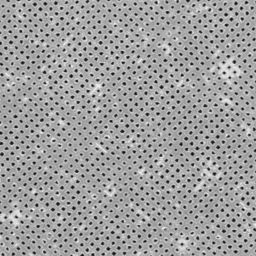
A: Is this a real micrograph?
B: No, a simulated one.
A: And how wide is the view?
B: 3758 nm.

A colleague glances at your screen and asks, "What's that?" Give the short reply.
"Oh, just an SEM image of a regular array of holes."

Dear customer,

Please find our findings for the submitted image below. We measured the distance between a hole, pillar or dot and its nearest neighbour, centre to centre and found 104 nm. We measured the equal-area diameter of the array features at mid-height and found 52.4 nm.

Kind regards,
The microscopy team